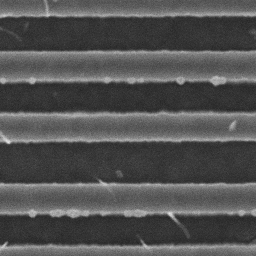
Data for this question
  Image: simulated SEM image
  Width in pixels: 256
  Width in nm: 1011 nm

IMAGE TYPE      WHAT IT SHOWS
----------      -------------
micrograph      lines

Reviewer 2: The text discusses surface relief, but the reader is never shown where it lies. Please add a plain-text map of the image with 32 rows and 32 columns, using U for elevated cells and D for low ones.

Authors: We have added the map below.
UUUUUUUUUUUUUUUUUUUUUUUUUUUUUUUU
UUUUUUUUUUUUUUUUUUUUUUUUUUUUUUUU
DDDDDDDDDDDDDDDDDDDDDDDDDDDDDDDD
DDDDDDDDDDDDDDDDDDDDDDDDDDDDDDDD
DDDDDDDDDDDDDDDDDDDDDDDDDDDDDDDD
DDDDDDDDDDDDDDDDDDDDDDDDDDDDDDDD
DDDDUUDDDDDUUDUDUUUUUUUUDUUDUUDU
UUUUUUUUUUUUUUUUUUUUUUUUUUUUUUUU
UUUUUUUUUUUUUUUUUUUUUUUUUUUUUUUU
UUUUUUUUUUUUUUUUUUUUUUUUUUUUUUUU
DDDDDDDDDDDDDDDDDDDDDDDDDDDUDDDD
DDDDDDDDDDDDDDDDDDDDDDDDDDDDDDDD
DDDDDDDDDDDDDDDDDDDDDDDDDDDDDDDD
DDDDDDDDDDDDDDDDDDDDDDDDDDDDDDDD
UUUUUUUUUUUUUUUUUUUUUUUUUUUUUUUU
UUUUUUUUUUUUUUUUUUUUUUUUUUUUUUUU
UUUUUUUUUUUUUUUUUUUUUUUUUUUUUUUU
UUUUUUUUUUUUUUUUUUUUUUUUUUUUUDUU
DDDDDDDDDDDDDDDDDDDDDDDDDDDDDDDD
DDDDDDDDDDDDDDDDDDDDDDDDDDDDDDDD
DDDDDDDDDDDDDDDDDDDDDDDDDDDDDDDD
DDDDDDDDDDDDDDDDDDDDDDDDDDDDDDDD
DDDDDDDDDDDDDDDDDDDDDDDDDDDDDDDD
UUUUUUUUUUUUUUUUUUUUUUUUUUUUUUUU
UUUUUUUUUUUUUUUUUUUUUUUUUUUUUUUU
UUUUUUUUUUUUUUUUUUUUUUUUUUUUUUUU
UUUUUUUUUUUUUUUUUUUUUUUUUUUUUUUU
DDDDDDDDDDDDDDDDDDDDDDDDDDDDDDDD
DDDDDDDDDDDDDDDDDDDDDDDDDDDDDDDD
DDDDDDDDDDDDDDDDDDDDDDDDDDDDDDDD
DDDDDDDDDDDDDDDDDDDDDDDDDDDDDDDD
UUUUUUUUUUUUUUUUUUUUUUUUUUUUUUUU